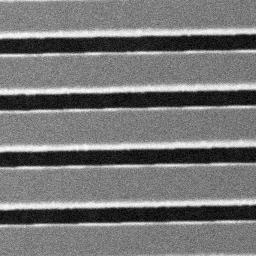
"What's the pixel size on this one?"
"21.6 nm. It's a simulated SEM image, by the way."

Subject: lines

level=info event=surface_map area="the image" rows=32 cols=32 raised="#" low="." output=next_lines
################################
################################
################################
################################
###########.....................
................................
.......................#########
################################
################################
################################
################################
########........................
................................
.......................#########
################################
################################
################################
################################
#################...............
................................
..........................######
################################
################################
################################
################################
##############################..
................................
................................
################################
################################
################################
################################